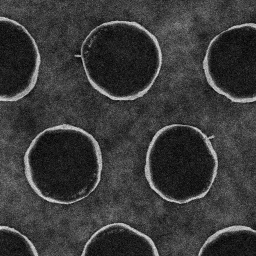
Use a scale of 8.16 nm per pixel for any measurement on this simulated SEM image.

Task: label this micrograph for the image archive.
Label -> raised bodies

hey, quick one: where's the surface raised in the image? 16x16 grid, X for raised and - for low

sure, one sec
----------------
X------X--------
XX---XXXXX---XXX
XX---XXXXX---XXX
XX---XXXXX---XXX
XX----XXX-----XX
----------------
----------------
--XXXX----XXX---
--XXXX---XXXX---
--XXXX---XXXXX--
--XXXX----XXX---
---XX------X----
----------------
X-----XXX-----XX
XX---XXXXX---XXX